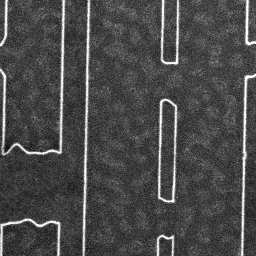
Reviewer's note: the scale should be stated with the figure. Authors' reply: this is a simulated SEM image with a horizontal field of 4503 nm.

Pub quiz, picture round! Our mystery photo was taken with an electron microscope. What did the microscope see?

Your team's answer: one or a few lines or trenches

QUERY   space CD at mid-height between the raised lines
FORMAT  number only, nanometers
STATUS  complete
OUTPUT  1220